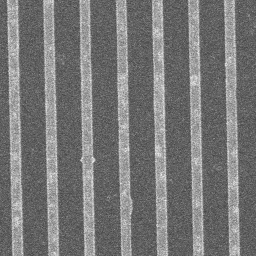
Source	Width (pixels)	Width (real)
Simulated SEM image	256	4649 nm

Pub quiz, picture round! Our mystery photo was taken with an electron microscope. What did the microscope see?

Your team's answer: parallel lines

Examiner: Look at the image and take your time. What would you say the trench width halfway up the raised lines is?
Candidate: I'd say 474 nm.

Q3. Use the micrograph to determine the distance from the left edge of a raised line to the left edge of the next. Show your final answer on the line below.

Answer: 656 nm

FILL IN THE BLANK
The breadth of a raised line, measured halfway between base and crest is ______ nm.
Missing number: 182